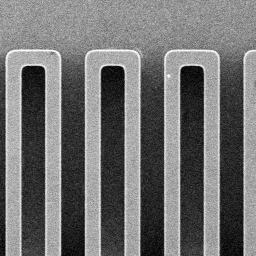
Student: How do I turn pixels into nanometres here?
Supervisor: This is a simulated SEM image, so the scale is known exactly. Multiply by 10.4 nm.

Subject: groups of lines, slits or small figures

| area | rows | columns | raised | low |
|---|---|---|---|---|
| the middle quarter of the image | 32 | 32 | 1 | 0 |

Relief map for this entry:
00000111110000111110000001111100
00000111100000011110000001111000
00000111100000011110000001111000
00000111100000011110000001111000
00000111100000011110000001111000
00000111100000011110000001111000
00000111100000011110000001111000
00000111100000011110000001111000
00000111100000011110000001111000
00000111100000011110000001111000
00000111100000011110000001111000
00000111100000011110000001111000
00000111100000011110000001111000
00000111100000011110000001111000
00000111100000011110000001111000
00000111100000011110000001111000
00000111100000011110000001111000
00000111100000011110000001111000
00000111100000011110000001111000
00000111100000011110000001111000
00000111100000011110000001111000
00000111100000011110000001111000
00000111100000011110000001111000
00000111100000011110000001111000
00000111100000011110000001111000
00000111100000011110000001111000
00000111100000011110000001111000
00000111100000011110000001111000
00000111100000011110000001111000
00000111100000011110000001111000
00000111100000011110000001111000
00000111100000011110000001111000